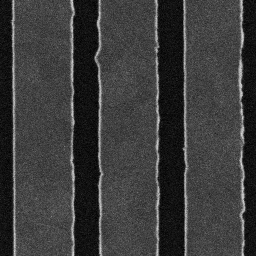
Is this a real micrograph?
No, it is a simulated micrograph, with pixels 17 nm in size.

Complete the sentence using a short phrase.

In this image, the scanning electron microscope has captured one or a few lines or trenches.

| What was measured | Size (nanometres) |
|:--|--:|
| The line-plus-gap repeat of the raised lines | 1450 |